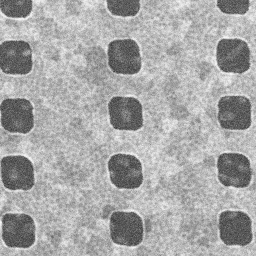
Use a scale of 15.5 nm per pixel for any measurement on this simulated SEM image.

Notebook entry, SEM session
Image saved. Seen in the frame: a regular array of holes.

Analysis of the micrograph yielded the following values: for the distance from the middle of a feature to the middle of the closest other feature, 883 nm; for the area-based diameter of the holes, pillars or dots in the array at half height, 584 nm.